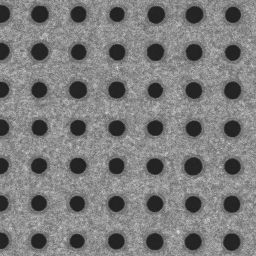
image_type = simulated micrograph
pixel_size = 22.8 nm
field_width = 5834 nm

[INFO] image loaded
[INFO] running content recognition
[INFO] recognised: a regular array of holes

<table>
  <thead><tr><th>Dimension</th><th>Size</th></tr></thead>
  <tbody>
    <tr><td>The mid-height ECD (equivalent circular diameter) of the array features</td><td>384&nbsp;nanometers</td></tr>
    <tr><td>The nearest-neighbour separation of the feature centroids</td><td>860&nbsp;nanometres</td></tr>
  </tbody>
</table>